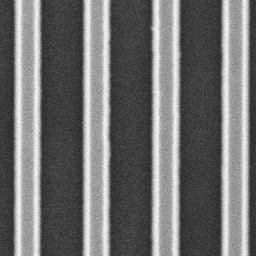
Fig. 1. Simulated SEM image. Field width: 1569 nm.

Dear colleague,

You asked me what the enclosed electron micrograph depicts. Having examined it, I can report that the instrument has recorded one or a few lines or trenches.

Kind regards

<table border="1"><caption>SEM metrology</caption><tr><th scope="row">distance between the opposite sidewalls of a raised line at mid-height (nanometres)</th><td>129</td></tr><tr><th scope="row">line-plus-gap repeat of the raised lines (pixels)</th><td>69.1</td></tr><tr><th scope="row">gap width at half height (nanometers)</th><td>298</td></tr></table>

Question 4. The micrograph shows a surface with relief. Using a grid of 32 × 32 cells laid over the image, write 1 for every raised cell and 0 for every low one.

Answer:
00111000000110000001110000001110
00111000000110000001110000001110
00111000000110000001110000001110
00111000000110000001110000001110
00111000000110000000110000001110
00111000000110000001110000001110
00111000000110000001110000001110
00111000000110000000110000001110
00111000000110000001110000001110
00111000000110000001110000001110
00111000000110000001110000001110
00111000000110000000110000001110
00111000000110000000110000001110
00111000000110000000110000001110
00111000000110000000110000001110
00111000000110000000110000001110
00111000000110000000110000001110
00111000000110000000110000001110
00111000000110000001110000001110
00111000000110000001110000001110
00111000000110000001110000001110
00111000000110000001110000001110
00111000000110000001110000001110
00111000000110000001110000001110
00111000000110000001110000001110
00111000000110000001110000001110
00111000000110000001110000001110
00111000000110000001110000001110
00111000000110000001110000001110
00111000000110000001110000001110
00111000000110000001110000001110
00111000000110000001110000001110